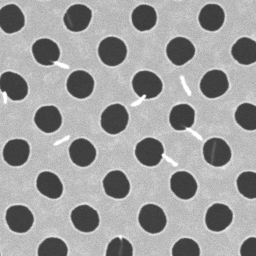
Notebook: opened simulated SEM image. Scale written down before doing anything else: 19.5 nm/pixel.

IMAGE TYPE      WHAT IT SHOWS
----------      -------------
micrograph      a regular array of holes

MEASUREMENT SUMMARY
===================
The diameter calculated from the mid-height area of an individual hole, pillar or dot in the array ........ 0.556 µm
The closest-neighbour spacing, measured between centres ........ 902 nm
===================